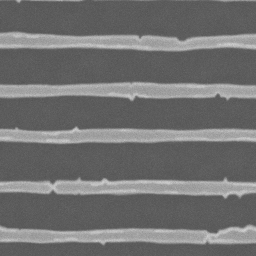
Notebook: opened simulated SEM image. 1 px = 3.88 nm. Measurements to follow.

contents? parallel lines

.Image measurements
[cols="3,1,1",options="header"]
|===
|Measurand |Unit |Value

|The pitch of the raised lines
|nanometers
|188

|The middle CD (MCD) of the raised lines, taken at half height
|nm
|45.6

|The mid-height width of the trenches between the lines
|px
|36.2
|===